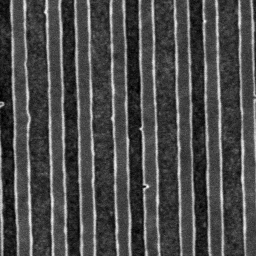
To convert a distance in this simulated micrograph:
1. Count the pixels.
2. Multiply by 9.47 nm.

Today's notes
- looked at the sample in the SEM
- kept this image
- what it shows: parallel lines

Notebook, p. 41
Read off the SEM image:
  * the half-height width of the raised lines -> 134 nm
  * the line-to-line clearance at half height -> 20.1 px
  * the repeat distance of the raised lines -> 0.305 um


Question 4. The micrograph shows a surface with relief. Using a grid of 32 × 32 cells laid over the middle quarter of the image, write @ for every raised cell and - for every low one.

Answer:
---@@@@-----@@@@---@@@------@@@@
---@@@@-----@@@@---@@@------@@@@
---@@@@-----@@@@---@@@------@@@@
---@@@@-----@@@----@@@------@@@@
---@@@@-----@@@----@@@@-----@@@@
---@@@@-----@@@@---@@@@-----@@@@
---@@@@-----@@@@---@@@@-----@@@@
---@@@@-----@@@@---@@@@-----@@@@
---@@@@-----@@@@---@@@@-----@@@@
----@@@-----@@@@---@@@@-----@@@@
----@@@-----@@@@---@@@@-----@@@@
----@@@-----@@@@---@@@@-----@@@@
----@@@-----@@@@---@@@@------@@@
----@@@-----@@@@---@@@@-----@@@@
----@@@-----@@@@---@@@@-----@@@@
----@@@-----@@@@---@@@@-----@@@@
---@@@@-----@@@@---@@@@-----@@@@
----@@@-----@@@@----@@@-----@@@@
----@@@------@@@----@@@------@@@
----@@@------@@@----@@@------@@@
----@@@------@@@----@@@------@@@
----@@@------@@@----@@@------@@@
----@@@------@@@----@@@------@@@
----@@@------@@@----@@@------@@@
----@@@------@@@----@@@------@@@
----@@@------@@@----@@@------@@@
----@@@------@@@----@@@------@@@
----@@@------@@@----@@@------@@@
----@@@------@@@----@@@------@@@
----@@@------@@@----@@@@-----@@@
----@@@------@@@-----@@@-----@@@
----@@@------@@@----@@@------@@@